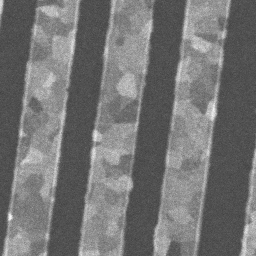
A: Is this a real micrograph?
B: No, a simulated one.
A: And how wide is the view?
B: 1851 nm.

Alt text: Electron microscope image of one or a few lines or trenches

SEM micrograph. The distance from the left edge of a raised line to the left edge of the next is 537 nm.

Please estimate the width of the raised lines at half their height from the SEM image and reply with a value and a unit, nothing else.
283 nanometers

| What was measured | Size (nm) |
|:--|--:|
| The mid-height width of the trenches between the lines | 258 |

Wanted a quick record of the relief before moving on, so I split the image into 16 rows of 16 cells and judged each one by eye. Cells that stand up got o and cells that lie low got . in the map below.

..ooo..oo...oo..
..ooo..oo...oo..
..ooo..oo..ooo..
..oo...oo..ooo..
..oo...oo..ooo..
..oo..ooo..ooo..
..oo..ooo..oo...
.ooo..ooo..oo...
.ooo..oo...oo...
.ooo..oo...oo...
.ooo..oo..ooo...
.oo...oo..ooo...
.oo..ooo..ooo...
.oo..ooo..oo...o
.oo..ooo..oo...o
ooo..ooo..oo...o